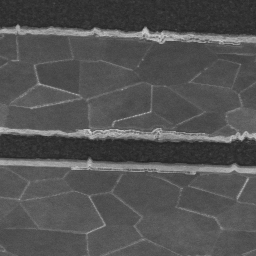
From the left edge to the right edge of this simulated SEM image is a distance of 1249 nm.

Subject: one or a few lines or trenches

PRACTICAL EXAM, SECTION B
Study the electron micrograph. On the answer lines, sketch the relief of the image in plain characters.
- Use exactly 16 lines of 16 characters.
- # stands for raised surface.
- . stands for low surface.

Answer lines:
................
................
################
################
################
################
################
################
.........#######
................
###########.....
################
################
################
################
################